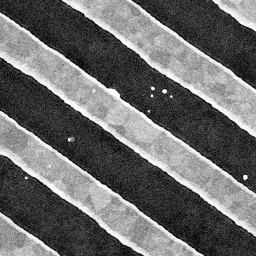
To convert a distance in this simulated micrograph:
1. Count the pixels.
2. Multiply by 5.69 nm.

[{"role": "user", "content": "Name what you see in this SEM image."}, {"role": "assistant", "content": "lines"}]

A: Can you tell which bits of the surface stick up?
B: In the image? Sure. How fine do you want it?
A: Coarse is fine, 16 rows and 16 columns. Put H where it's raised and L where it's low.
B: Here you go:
LLLLLHHHHLLLLLHH
HLLLLLHHHHLLLLLH
HHLLLLLLHHHLLLLL
HHHHLLLLLHHHHLLL
LLHHHLLLLLHHHHLL
LLLHHHHLLLLLHHHH
LLLLHHHHLLLLLHHH
HLLLLLHHHLLLLLLH
HHLLLLLHHHHLLLLL
HHHHLLLLLHHHLLLL
LHHHHLLLLLHHHHLL
LLLHHHLLLLLLHHHL
LLLLHHHHLLLLLHHH
LLLLLLHHHLLLLLHH
HHLLLLLHHHHLLLLL
HHHLLLLLHHHHLLLL